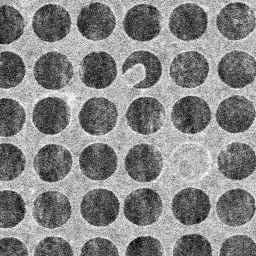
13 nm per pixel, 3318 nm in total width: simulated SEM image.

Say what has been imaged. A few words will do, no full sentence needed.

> a regular array of holes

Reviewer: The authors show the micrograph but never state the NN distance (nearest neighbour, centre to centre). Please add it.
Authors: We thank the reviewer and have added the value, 582 nanometres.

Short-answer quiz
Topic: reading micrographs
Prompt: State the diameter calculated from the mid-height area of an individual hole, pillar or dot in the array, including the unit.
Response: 0.506 micrometres